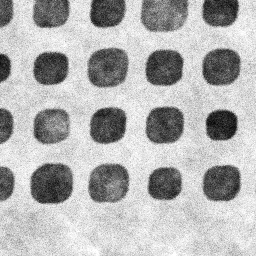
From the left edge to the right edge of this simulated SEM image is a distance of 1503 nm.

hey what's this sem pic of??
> a regular array of holes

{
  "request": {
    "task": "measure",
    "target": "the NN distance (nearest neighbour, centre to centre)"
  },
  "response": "0.332 micrometres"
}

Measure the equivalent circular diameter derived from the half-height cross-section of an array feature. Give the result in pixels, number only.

38.8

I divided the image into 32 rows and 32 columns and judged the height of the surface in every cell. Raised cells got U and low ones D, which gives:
DDUUDDDDDUUDDDDDUUDDDDDDUDDDDDUU
DDUUDDDDDUUDDDDDUUDDDDDDUDDDDDUU
DUUUDDDDUUUDDDDUUUDDDDDUUDDDDUUU
UUUUUUDUUUUUUUUUUUDDDDUUUUUUUUUU
UUUUUUUUUUUUUUUUUUUUUUUUUUUUUUUU
UUUUUUUUUUUUUUUUUUUUUUUUUUUUUUUU
UUUUUUDUUUUUDDDDUUUDDDUUUUDDDUUU
DUUUDDDDDUUDDDDDUUDDDDDUUDDDDDUU
DUUUDDDDDUUDDDDDUUDDDDDUUDDDDDUU
DUUUDDDDUUUDDDDDUUDDDDDUUDDDDDUU
UUUUUDDUUUUUDDDUUUUDDDUUUUDDDUUU
UUUUUUUUUUUUUUUUUUUUUUUUUUUUUUUU
UUUUUUUUUUUUUUUUUUUUUUUUUUUUUUUU
UUUUUUUUUUUUUDDUUUUDDDUUUUUUUUUU
DDUUUDDDDUUUDDDDUUDDDDDUUUDDDDUU
DDUUDDDDDUUDDDDDUUDDDDDUUUDDDDUU
DDUUDDDDDUUDDDDDUUDDDDDUUUDDDDUU
DUUUUDDDUUUUDDDUUUUDDDUUUUUDUUUU
UUUUUUUUUUUUUUUUUUUUUUUUUUUUUUUU
UUUUUUUUUUUUUUUUUUUUUUUUUUUUUUUU
UUUUUUDDUUUUUDDUUUUUUUUUUUUUUUUU
DUUUDDDDDUUDDDDDUUUDDDUUUUDDDDUU
DDUUDDDDDUUDDDDDUUUDDDDUUDDDDDUU
DDUUDDDDDUUDDDDDUUDDDDDUUDDDDDUU
DUUUDDDDDUUDDDDDUUUDDDUUUUDDDDUU
UUUUUUUUUUUUUUUUUUUUUUUUUUUUUUUU
UUUUUUUUUUUUUUUUUUUUUUUUUUUUUUUU
UUUUUUUUUUUUUUUUUUUUUUUUUUUUUUUU
UUUUUUUUUUUUUUUUUUUUUUUUUUUUUUUU
UUUUUUUUUUUUUUUUUUUUUUUUUUUUUUUU
UUUUUUUUUUUUUUUUUUUUUUUUUUUUUUUU
UUUUUUUUUUUUUUUUUUUUUUUUUUUUUUUU